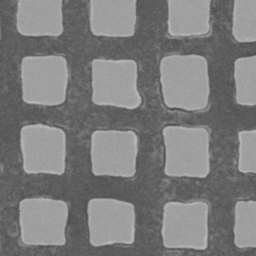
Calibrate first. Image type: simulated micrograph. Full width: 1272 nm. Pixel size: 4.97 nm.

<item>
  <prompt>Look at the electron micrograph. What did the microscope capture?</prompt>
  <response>a regular array of raised bodies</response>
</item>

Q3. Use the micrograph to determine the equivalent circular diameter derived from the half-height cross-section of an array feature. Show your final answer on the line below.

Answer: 253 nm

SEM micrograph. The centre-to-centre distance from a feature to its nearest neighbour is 343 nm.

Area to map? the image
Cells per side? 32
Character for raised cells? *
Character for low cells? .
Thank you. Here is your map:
..******...******....*****...***
..******...******....*****...***
..******...******....*****...***
..******...******....*****...***
.............***.............***
................................
................................
...*****............******....**
...*****....*****...******...***
...*****....*****...******...***
...*****....*****...******....**
...*****....*****.********....**
...*****....******.*.*****....**
................*....****.......
....................***.........
................................
...*****....****....******....**
...*****....*****....*****....**
...*****...******....*****....**
...*****...******..*******....**
...*****....*****....*****....**
.....***....*****....*****....**
................................
................................
................................
...*****...*****.....*****....**
...*****...******....*****...***
..******...******...******...***
...*****...******...******...***
...*****...******...******...***
....****....**.......*****...***
................................